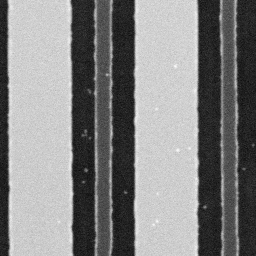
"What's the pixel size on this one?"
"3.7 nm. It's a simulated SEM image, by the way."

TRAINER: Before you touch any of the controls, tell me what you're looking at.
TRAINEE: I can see lines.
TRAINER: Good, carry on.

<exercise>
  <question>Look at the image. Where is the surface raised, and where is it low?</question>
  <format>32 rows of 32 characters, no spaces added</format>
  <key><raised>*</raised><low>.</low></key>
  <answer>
.********...**...********...**..
.********...**...********...**..
.********...**...********...*...
.********...**...********...**..
.********...**...********...**..
.********...**...********...*...
.********...**...********...**..
.********...**...********...**..
.********...**...********...**..
.********...**...********...**..
.********...**...********...**..
.********...**...********...**..
.********...**...********...**..
.********...**...********...**..
.********...**...********...**..
.********...**...********...**..
.********...**...********...**..
.********...**...********...**..
.********...**...********...**..
.********...**...********...**..
.********...**...********...**..
.********...**...********...**..
.********...**...********...**..
.********...**...********...**..
.********...**...********...**..
.********...**...********...**..
.********...**...********...**..
.********...**...********...**..
.********...**...********...**..
.********...**...********...**..
.********...**...********...**..
.********...**...********...**..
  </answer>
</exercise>